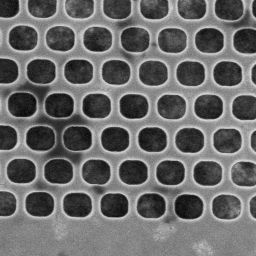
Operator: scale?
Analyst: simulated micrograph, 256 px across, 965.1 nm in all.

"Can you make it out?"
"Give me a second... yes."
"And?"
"a regular array of holes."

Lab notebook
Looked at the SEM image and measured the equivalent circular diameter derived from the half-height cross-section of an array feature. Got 106 nanometers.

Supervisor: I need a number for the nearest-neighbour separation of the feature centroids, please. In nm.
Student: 140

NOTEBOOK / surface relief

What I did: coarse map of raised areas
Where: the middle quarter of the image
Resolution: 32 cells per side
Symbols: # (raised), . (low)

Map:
.......###......###......###....
.......##........##.......##....
.......##........##.......##....
.......###......###.......##....
#.....####......###......####...
#####################..########.
################################
.#####...#######..##############
..###......###......####......##
...#........##.......##.......##
...#........##.......##........#
..###.......##.......##........#
..###......###.......###......##
#######...#####....######....###
################################
##...###########################
......####.....####......####...
.......##.......###.......##....
.......##.......##........##....
.......##.......###.......##....
.......###......###.......##....
##...#####.....#####.....####...
################################
################################
.####.....#####.....####.....###
..###......###.......##.......##
..##........##.......##.......##
..##........##.......##.......##
..###......###.......##.......##
.#####.....####.....####.....###
################################
################################